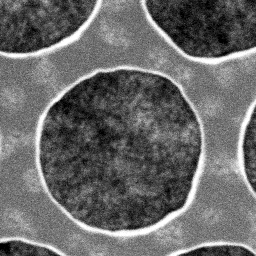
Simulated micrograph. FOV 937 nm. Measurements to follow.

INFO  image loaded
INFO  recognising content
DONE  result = holes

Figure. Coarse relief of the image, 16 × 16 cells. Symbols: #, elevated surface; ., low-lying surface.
......###.......
.....#####......
....#######.....
############..##
######...#######
####.......#####
###.........####
###.........####
##...........##.
##...........##.
##..........###.
###.........####
###.........####
####.......#####
#######.########
...#########...#